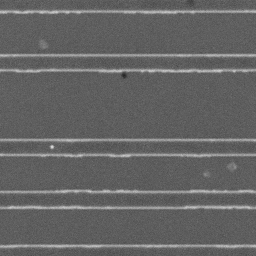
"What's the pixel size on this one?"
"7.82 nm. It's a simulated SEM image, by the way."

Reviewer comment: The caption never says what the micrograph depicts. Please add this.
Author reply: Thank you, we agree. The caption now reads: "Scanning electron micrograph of lines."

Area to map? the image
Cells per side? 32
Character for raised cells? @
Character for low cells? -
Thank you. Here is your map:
@@@@@@@@@@@@@@@@@@@@@@@@@@@@@@@@
@-@@-@@@@@--------@@@@----------
--------------------------------
--------------------------------
--------------------------------
--------------------------------
--------------------------------
@@@@@@@@@@@@@@@@@@@@@@@@@@@@@@@@
@@@@@@@@@@@@@@@@@@@@@@@@@@@@@@@@
--------------------------------
--------------------------------
--------------------------------
--------------------------------
--------------------------------
--------------------------------
--------------------------------
--------------------------------
@@@@@@@@@@@@@@@@@@@@@@@@@@@@@@@@
@@@@@@@@@@@@@@@@@@@@@@@@@@@@@@@@
--------@@@---@@--------@@------
--------------------------------
--------------------------------
--------------------------------
--------------------------------
@@@@@@@@@@@@@@@@@@@@@@@@@@@@@@@@
@@@@@@@@@@@@@@@@@@@@@@@@@@@@@@@@
--------------------------------
--------------------------------
--------------------------------
--------------------------------
--------------------------------
@@@@@@@@@@@@@@@@@@@@@@@@@@@@@@@@